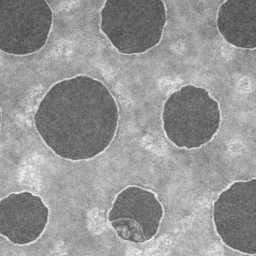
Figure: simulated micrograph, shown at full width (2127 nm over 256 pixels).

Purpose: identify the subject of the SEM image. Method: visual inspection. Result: raised bodies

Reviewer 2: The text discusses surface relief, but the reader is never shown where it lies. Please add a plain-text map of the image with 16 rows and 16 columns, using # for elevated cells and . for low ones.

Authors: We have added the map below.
###...####....##
###...####....##
###....###....##
................
................
...####....##...
..#####...####..
..#####...####..
...####...###...
...###..........
................
...............#
###....###...###
###....###...###
###......#....##
..............##